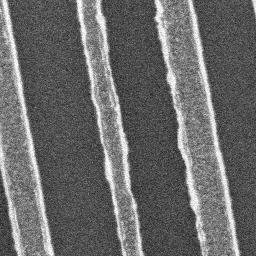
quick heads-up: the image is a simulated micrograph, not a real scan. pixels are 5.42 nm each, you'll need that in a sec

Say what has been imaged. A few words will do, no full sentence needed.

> one or a few lines or trenches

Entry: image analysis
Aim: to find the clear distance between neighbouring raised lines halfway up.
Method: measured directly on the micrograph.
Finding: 339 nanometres